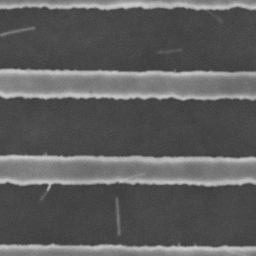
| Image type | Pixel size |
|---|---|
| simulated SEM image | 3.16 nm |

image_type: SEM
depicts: lines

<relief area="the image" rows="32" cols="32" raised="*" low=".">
********************************
................................
................................
................................
................................
................................
................................
................................
................................
********************************
********************************
********************************
.........................*......
................................
................................
................................
................................
................................
................................
................................
********************************
********************************
********************************
................................
................................
................................
................................
................................
................................
................................
................................
********************************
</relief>